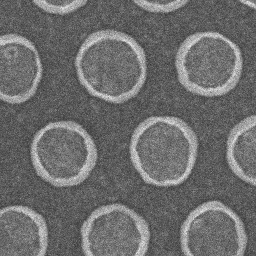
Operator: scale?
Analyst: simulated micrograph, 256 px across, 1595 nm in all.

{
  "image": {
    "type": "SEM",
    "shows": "raised bodies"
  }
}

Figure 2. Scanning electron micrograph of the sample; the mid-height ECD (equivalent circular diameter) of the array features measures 387 nm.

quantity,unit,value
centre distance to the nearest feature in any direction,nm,614